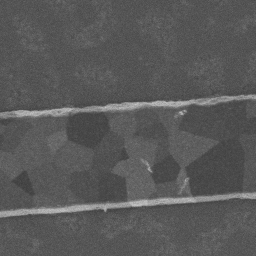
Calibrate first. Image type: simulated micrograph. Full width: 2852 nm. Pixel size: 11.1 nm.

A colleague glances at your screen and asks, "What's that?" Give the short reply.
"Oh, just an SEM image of one or a few lines or trenches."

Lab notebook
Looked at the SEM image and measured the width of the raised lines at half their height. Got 1.09 micrometres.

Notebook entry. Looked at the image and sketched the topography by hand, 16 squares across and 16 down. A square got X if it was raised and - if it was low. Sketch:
----------------
----------------
----------------
----------------
----------------
----------------
---------XXXXXXX
XXXXXXXXXXXXXXXX
XXXXXXXXXXXXXXXX
XXXXXXXXXXXXXXXX
XXXXXXXXXXXXXXXX
XXXXXXXXXXXXXXXX
XXXXXXXXXXX-----
----------------
----------------
----------------